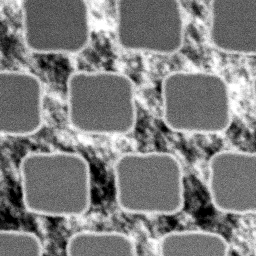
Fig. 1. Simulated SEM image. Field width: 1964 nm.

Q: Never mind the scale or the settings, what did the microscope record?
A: raised bodies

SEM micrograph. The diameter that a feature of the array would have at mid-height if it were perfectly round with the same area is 534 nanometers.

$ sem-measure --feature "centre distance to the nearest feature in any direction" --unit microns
0.713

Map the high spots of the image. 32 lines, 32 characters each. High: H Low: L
LLLHHHHHHHHLLLLHHHHHHHLLLLHHHHHH
LLLHHHHHHHHLLLLHHHHHHHHLLLHHHHHH
LLLHHHHHHHHLLLLHHHHHHHHLHLHHHHHH
LLLHHHHHHHHLLLLHHHHHHHHLLHHHHHHH
LLLHHHHHHHHLLLLHHHHHHHHLLLHHHHHH
LLLHHHHHHHHLLLLHHHHHHHHLHHLHHHHH
LLLLLHHHHHLLLLLLLLLHHHLLHLLLHHHH
LLLLLLLLLLLLLLLLLLLLLLLLLLLHLLLL
LLLLLLLLLLLLLLLLLLLLLLLLLLHLLLLL
HHHHLLLLLHHHHHHHLLLLLHHHHHHLLLLL
HHHHHLLLHHHHHHHHHLLLHHHHHHHHLLLH
HHHHHLLLLHHHHHHHHLLLHHHHHHHHHLLL
HHHHHLLLLHHHHHHHHLLLHHHHHHHHHLLL
HHHHHLLLLHHHHHHHHLLLLHHHHHHHHLLH
HHHHHLLLLHHHHHHHHLLLHHHHHHHHHLLL
HHHHHLLLLHHHHHHHHLLLLHHHHHHHHLLL
HHHHLLLLLLHHHHHHLLLLLLLLLLHHLLLL
LLLLLLLLLLLLLLLLLLLLLLLLLLLLLLLL
LLLLLLLLLLLLLLLLLLLLLLLLLLLLLLLL
LLLHHHHHHHLLLLLHHHHHHHLLLLLHHHHH
LLLHHHHHHHHLLLHHHHHHHHHLLLHHHHHH
LLLHHHHHHHHLLLHHHHHHHHHLLLHHHHHH
LLLHHHHHHHHLLLLHHHHHHHHLLLHHHHHH
LLLHHHHHHHHLLLLHHHHHHHHLLLHHHHHH
LLLHHHHHHHHLLLLHHHHHHHHLLLHHHHHH
LLLHHHHHHHHLLLLHHHHHHHHLLLLHHHHH
LLLLLHHHHHHLLLLLHHHHHHLLLLLLHHHH
LLLLLLLLLLLLLLLLLLLLLLLLLLLLLLLL
LLLLLLLLHLLLLLLLLLLLLLLLLLLLLLLL
HHHHLLLLLHHHHHHHLLLLLHHHHHHLLLLL
HHHHHLLLLHHHHHHHHLLLHHHHHHHHLLLL
HHHHHLLLHHHHHHHHHLLLHHHHHHHHLLLL